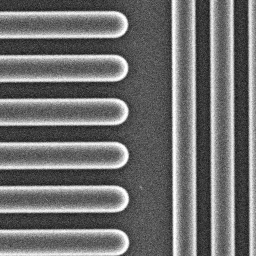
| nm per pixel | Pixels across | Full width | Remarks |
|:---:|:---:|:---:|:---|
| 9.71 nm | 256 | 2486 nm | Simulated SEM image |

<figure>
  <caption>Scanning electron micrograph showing groups of lines, slits or small figures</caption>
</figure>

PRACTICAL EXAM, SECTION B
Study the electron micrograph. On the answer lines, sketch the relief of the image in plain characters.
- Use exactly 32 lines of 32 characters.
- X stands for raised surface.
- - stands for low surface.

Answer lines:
----------------------XX--XXX--X
----------------------XX--XXX--X
XXXXXXXXXXXXXXXX------XX--XXX--X
XXXXXXXXXXXXXXXX------XX--XXX--X
XXXXXXXXXXXXXXX-------XX--XXX--X
----------------------XX---XX--X
----------------------XX---XX--X
XXXXXXXXXXXXXXX-------XX---XX--X
XXXXXXXXXXXXXXXX------XX---XX--X
XXXXXXXXXXXXXXX-------XX---XX--X
----------------------XX---XX--X
----------------------XX---XX--X
----------------------XX---XX--X
XXXXXXXXXXXXXXXX------XX---XX--X
XXXXXXXXXXXXXXXX------XX---XX--X
XXXXXXXXX-------------XX---XX--X
----------------------XX---XX--X
----------------------XX---XX--X
XXXXXXXXXXXXXXXX------XX---XX--X
XXXXXXXXXXXXXXXX------XX---XX--X
XXXXXXXXXXXXXXX-------XX---XX--X
----------------------XX---XX--X
----------------------XX---XX--X
XXXXXXXXXXXXXXX-------XX---XX--X
XXXXXXXXXXXXXXXX------XX---XX--X
XXXXXXXXXXXXXXXX------XX---XX--X
----------------------XX---XX--X
----------------------XX---XX--X
----------------------XX---XX--X
XXXXXXXXXXXXXXXX------XX---XX--X
XXXXXXXXXXXXXXXX------XX---XX--X
XXXXXXXXXXXXXXX-------XX---XX--X